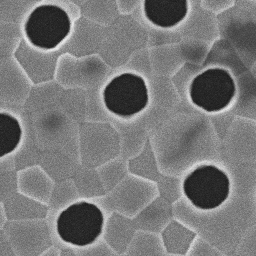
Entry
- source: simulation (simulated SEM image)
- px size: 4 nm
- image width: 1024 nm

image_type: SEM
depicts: holes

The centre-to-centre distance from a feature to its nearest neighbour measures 390 nm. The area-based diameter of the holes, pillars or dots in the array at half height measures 174 nm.